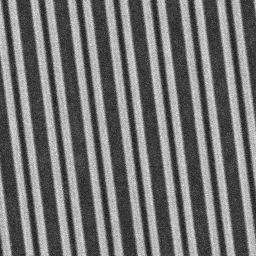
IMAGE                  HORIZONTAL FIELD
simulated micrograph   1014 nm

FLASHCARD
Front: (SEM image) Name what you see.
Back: parallel lines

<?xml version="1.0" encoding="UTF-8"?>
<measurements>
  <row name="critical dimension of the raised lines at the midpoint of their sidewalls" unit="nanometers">28.9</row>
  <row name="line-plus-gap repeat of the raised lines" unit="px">18.4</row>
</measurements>